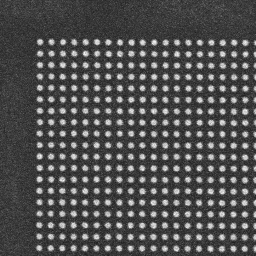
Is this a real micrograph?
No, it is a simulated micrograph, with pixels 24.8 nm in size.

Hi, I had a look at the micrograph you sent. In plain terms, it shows a regular array of raised bodies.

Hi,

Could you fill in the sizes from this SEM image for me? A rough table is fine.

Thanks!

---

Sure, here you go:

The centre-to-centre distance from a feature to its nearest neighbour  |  278 nanometres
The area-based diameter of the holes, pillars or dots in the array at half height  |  0.122 microns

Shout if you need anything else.